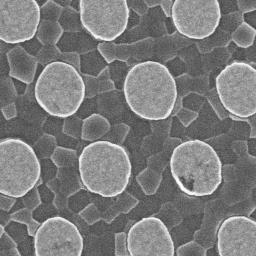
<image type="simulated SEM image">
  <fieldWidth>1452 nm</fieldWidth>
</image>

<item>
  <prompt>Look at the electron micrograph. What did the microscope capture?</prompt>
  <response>raised bodies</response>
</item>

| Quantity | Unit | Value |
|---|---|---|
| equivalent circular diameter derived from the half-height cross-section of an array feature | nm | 285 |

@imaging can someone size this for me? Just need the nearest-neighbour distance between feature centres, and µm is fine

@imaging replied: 0.498